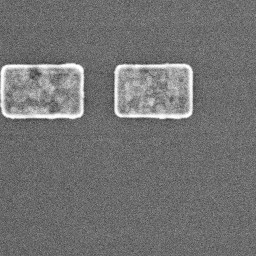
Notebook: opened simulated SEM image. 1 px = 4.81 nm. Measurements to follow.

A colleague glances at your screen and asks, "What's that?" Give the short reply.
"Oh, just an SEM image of wiring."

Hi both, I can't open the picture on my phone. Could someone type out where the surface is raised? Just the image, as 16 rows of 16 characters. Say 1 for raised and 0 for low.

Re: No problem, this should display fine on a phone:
0000000000000000
0000000000000000
0000000000000000
0000000000000000
1111100111110000
1111100111110000
1111100111110000
0000000000000000
0000000000000000
0000000000000000
0000000000000000
0000000000000000
0000000000000000
0000000000000000
0000000000000000
0000000000000000